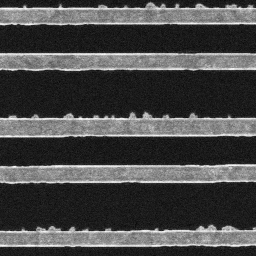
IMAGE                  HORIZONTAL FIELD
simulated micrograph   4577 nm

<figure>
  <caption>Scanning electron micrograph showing lines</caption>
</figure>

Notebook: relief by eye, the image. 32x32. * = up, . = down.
................................
********************************
********************************
................................
................................
................................
................................
********************************
********************************
................................
................................
................................
................................
................................
................................
********************************
********************************
................................
................................
................................
................................
********************************
********************************
................................
................................
................................
................................
................................
................................
********************************
********************************
................................